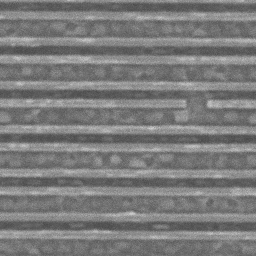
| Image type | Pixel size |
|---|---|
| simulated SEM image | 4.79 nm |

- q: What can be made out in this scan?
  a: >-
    parallel lines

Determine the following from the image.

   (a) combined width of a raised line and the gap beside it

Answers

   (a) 105 nm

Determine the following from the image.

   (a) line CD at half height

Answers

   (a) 34.1 nm